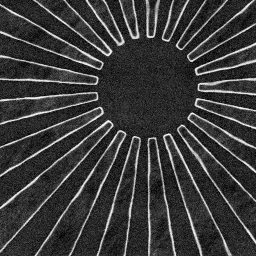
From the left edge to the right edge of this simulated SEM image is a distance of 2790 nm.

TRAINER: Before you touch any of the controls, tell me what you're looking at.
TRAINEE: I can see groups of lines, slits or small figures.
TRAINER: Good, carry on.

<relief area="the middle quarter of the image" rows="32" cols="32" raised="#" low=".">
.......###......................
................................
#####...........................
########........................
########........................
................................
................................
...#####........................
########........................
######..........................
##..............................
.......###......................
.....####.......................
...#####.......................#
######.....#....................
#####.....##.................#..
###.....###..................##.
#......###...##..............###
.....####....##...#......##...##
....#####...##...##..##..###..##
...#####...###...##..##...##...#
..#####...###...###..##...###...
.#####....###...##...###..###...
#####....####...##...###...##...
####....####...###...###...###..
###.....####...###...###...####.
##.....####....###...###...####.
##.....####....###...###....####
#.....####....####...####...####
.....#####....####...####...####
.....####.....###....####....###
....#####....####....####....###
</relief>